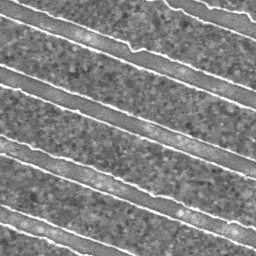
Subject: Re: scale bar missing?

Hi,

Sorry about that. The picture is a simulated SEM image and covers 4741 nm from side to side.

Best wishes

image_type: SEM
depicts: one or a few lines or trenches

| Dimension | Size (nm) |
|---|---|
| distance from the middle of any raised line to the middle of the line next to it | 1210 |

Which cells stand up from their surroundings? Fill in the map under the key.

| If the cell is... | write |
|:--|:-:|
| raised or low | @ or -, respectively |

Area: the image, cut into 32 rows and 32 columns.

--@@@@@@@@@@@@@@@@@@@-----@@@@@@
-----@@@@@@@@@@@@@@@@@@------@@@
@@------@@@@@@@@@@@@@@@@@------@
@@@@@------@@@@@@@@@@@@@@@@@----
@@@@@@@------@@@@@@@@@@@@@@@@@@-
@@@@@@@@@@------@@@@@@@@@@@@@@@@
@@@@@@@@@@@@@------@@@@@@@@@@@@@
@@@@@@@@@@@@@@@------@@@@@@@@@@@
-@@@@@@@@@@@@@@@@@------@@@@@@@@
---@@@@@@@@@@@@@@@@@@------@@@@@
------@@@@@@@@@@@@@@@@@------@@@
@@@-----@@@@@@@@@@@@@@@@@@------
@@@@@------@@@@@@@@@@@@@@@@@@---
@@@@@@@@------@@@@@@@@@@@@@@@@@-
@@@@@@@@@@@-----@@@@@@@@@@@@@@@@
@@@@@@@@@@@@@@-----@@@@@@@@@@@@@
@@@@@@@@@@@@@@@@------@@@@@@@@@@
-@@@@@@@@@@@@@@@@@@------@@@@@@@
----@@@@@@@@@@@@@@@@@@------@@@@
@-----@@@@@@@@@@@@@@@@@@------@@
@@@@------@@@@@@@@@@@@@@@@@-----
@@@@@@------@@@@@@@@@@@@@@@@@@--
@@@@@@@@@------@@@@@@@@@@@@@@@@@
@@@@@@@@@@@------@@@@@@@@@@@@@@@
@@@@@@@@@@@@@@-----@@@@@@@@@@@@@
@@@@@@@@@@@@@@@@@------@@@@@@@@@
--@@@@@@@@@@@@@@@@@------@@@@@@@
-----@@@@@@@@@@@@@@@@@------@@@@
@@------@@@@@@@@@@@@@@@@@------@
@@@@@-----@@@@@@@@@@@@@@@@@@----
@@@@@@@------@@@@@@@@@@@@@@@@@--
@@@@@@@@@@------@@@@@@@@@@@@@@@@